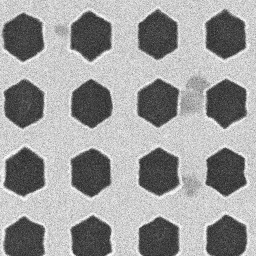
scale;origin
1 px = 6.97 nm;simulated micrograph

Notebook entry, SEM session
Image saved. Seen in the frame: a regular array of holes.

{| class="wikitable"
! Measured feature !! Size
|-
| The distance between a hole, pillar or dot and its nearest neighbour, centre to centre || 466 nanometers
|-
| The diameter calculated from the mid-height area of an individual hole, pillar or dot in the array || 300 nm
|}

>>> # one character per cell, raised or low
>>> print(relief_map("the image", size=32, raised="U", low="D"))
UUUUUUUUUUUUUUUUUUUUUUUUUUUUUUUU
UUUUUUUUUUUUUUUUUUUDUUUUUUUUUUUU
UDDDDUUUUUDDDUUUUUDDDDUUUUDDDDUU
DDDDDUUUUDDDDDUUUDDDDDUUUUDDDDDU
DDDDDUUUUDDDDDUUUDDDDDUUUUDDDDDU
UDDDDUUUUDDDDDUUUDDDDDUUUUDDDDDU
UDDDDUUUUUDDDUUUUUDDDUUUUUUDDDUU
UUUUUUUUUUUUUUUUUUUUUUUUUUUUUUUU
UUUUUUUUUUUUUUUUUUUUUUUUUUUUUUUU
UUUUUUUUUUUUUUUUUUUUUUUUUUUUUUUU
UUDDUUUUUUDDUUUUUUUDDUUUUUUDDDUU
UDDDDUUUUDDDDDUUUUDDDDUUUUDDDDDU
UDDDDDUUUDDDDDUUUDDDDDUUUUDDDDDU
UDDDDUUUUDDDDDUUUDDDDDUUUUDDDDDU
UDDDDUUUUDDDDDUUUUDDDDUUUUDDDDDU
UUDDUUUUUUUDUUUUUUUDUUUUUUUDDUUU
UUUUUUUUUUUUUUUUUUUUUUUUUUUUUUUU
UUUUUUUUUUUUUUUUUUUUUUUUUUUUUUUU
UUUUUUUUUUUUUUUUUUUUUUUUUUUUUUUU
UUDDDUUUUUDDDUUUUUDDDDUUUUDDDDUU
UDDDDDUUUDDDDDUUUDDDDDUUUUDDDDDU
UDDDDDUUUDDDDDUUUDDDDDUUUUDDDDUU
UDDDDDUUUDDDDDUUUDDDDDUUUUDDDDDU
UDDDDUUUUUDDDUUUUUDDDDUUUUUDDDUU
UUUUUUUUUUUDUUUUUUUUUUUUUUUUUUUU
UUUUUUUUUUUUUUUUUUUUUUUUUUUUUUUU
UUUUUUUUUUUUUUUUUUUUUUUUUUUUUUUU
UUDDUUUUUUUDUUUUUUUDDUUUUUUDDDUU
UDDDDUUUUDDDDDUUUUDDDDUUUUDDDDDU
UDDDDUUUUDDDDDUUUDDDDDUUUUDDDDDU
UDDDDUUUUDDDDDUUUDDDDDUUUUDDDDDU
UDDDDUUUUDDDDDUUUUDDDDUUUUDDDDUU